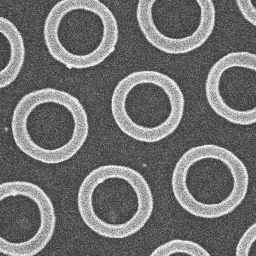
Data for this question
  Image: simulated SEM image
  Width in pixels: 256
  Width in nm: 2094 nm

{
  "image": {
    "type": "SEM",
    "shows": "ring-shaped raised bodies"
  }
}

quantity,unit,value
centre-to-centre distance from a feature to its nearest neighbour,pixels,97.2